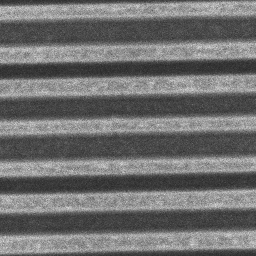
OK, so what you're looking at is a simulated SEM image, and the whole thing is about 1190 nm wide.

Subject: parallel lines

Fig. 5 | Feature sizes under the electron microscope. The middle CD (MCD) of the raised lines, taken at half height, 86.6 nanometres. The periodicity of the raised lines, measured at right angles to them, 179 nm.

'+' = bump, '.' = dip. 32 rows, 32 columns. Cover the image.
.........+++++++++++++++++++++++
++++++++++++++++++++++++++++++++
+++.............................
................................
................................
.................+++++++++++++++
++++++++++++++++++++++++++++++++
++++++++++++++++++++++++++++....
................................
...................+++++++++++++
++++++++++++++++++++++++++++++++
++++++++++++++++++++++++++++++++
................................
................................
...........................+++++
++++++++++++++++++++++++++++++++
+++++++++++++++++++.............
................................
................................
................................
++++++++++++++++++++++++++++++++
++++++++++++++++++++++++++++++++
................................
................................
++++++++++++++++++++++++++++++++
++++++++++++++++++++++++++++++++
++++++++++......................
................................
................................
++++++++++++++++++++++++++++++++
++++++++++++++++++++++++++++++++
++++++++++++++++++..............